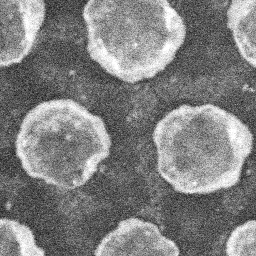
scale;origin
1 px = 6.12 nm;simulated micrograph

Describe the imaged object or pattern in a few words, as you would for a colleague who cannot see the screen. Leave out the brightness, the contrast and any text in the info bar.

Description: raised bodies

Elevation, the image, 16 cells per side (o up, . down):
ooo..oooooo....o
oo...oooooo....o
oo....ooooo....o
oo....ooooo....o
.......oo.......
................
...o............
.ooooo....ooooo.
.oooooo...ooooo.
.ooooo....ooooo.
..oooo....ooooo.
...oo......oooo.
................
................
oo.....ooo.....o
oo....ooooo...oo